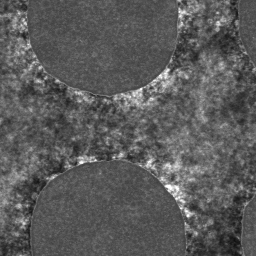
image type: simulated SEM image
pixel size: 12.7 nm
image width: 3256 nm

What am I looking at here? raised bodies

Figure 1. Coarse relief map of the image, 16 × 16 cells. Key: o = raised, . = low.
..ooooooooo....o
..ooooooooo....o
..ooooooooo....o
..ooooooooo.....
...ooooooo......
.....oooo.......
................
................
................
................
.....oooo.......
...ooooooo......
..ooooooooo.....
..ooooooooo....o
..oooooooooo...o
..oooooooooo...o